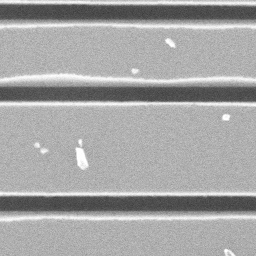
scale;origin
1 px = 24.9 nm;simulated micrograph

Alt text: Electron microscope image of lines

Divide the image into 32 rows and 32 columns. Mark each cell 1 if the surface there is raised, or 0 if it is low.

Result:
00000000000000000000000001111111
00000000000000000000000000000000
00000000000000000000000000000000
11111111111111111111111111111111
11111111111111111111111111111111
11111111111111111111111111111111
11111111111111111111111111111111
11111111111111111111111111111111
11111111111111111111111111111111
11111111111111111111111111111111
00000000000000000000000000000000
00000000000000000000000000000000
00000000000000000000000000000000
11111111111111111111111111111111
11111111111111111111111111111111
11111111111111111111111111111111
11111111111111111111111111111111
11111111111111111111111111111111
11111111111111111111111111111111
11111111111111111111111111111111
11111111111111111111111111111111
11111111111111111111111111111111
11111111111111111111111111111111
11111111111111111111111111111111
00000000000000000000000000000000
00000000000000000000000000000000
00000000000000000000000000000000
11111111111111111111111111111111
11111111111111111111111111111111
11111111111111111111111111111111
11111111111111111111111111111111
11111111111111111111111111111111